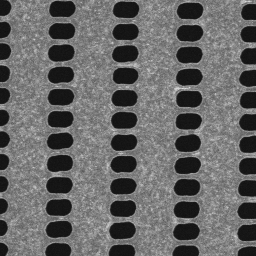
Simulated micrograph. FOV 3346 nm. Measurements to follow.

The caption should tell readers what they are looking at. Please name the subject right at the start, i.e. a regular array of holes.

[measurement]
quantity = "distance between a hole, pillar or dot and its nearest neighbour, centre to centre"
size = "288 nm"